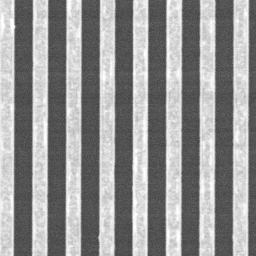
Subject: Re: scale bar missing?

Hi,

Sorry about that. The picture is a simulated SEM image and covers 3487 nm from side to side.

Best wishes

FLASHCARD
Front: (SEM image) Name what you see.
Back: parallel lines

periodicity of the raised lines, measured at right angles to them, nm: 456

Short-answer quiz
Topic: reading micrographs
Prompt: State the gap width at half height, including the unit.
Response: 269 nm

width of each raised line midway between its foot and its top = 196 nm